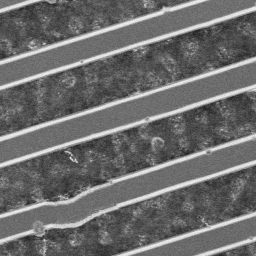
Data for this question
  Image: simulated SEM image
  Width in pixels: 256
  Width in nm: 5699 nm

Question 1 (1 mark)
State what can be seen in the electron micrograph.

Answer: one or a few lines or trenches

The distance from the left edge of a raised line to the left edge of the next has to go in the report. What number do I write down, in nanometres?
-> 1640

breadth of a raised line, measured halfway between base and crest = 0.528 um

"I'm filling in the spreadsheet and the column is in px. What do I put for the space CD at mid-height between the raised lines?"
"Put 49.4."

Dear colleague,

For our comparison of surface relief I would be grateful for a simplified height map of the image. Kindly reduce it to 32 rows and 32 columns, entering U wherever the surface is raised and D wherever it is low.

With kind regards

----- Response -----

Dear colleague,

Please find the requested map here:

UUUDDDDDDDDDDDDDDDDDDDDDUUUUUUUU
DDDDDDDDDDDDDDDDDDDDUUUUUUUUUUDD
DDDDDDDDDDDDDDDDDUUUUUUUUUUDDDDD
DDDDDDDDDDDDDDUUUUUUUUUUDDDDDDDD
DDDDDDDDDDDUUUUUUUUUUDDDDDDDDDDD
DDDDDDDDUUUUUUUUUUDDDDDDDDDDDDDD
DDDDDUUUUUUUUUDDDDDDDDDDDDDDDDDD
DUUUUUUUUUUDDDDDDDDDDDDDDDDDDDDD
UUUUUUUUDDDDDDDDDDDDDDDDDDDDDUUU
UUUUUDDDDDDDDDDDDDDDDDDDDDUUUUUU
UUDDDDDDDDDDDDDDDDDDDDUUUUUUUUUU
DDDDDDDDDDDDDDDDDDDUUUUUUUUUUUDD
DDDDDDDDDDDDDDDDUUUUUUUUUUDDDDDD
DDDDDDDDDDDDDUUUUUUUUUUDDDDDDDDD
DDDDDDDDDDUUUUUUUUUUDDDDDDDDDDDD
DDDDDDUUUUUUUUUUUDDDDDDDDDDDDDDD
DDDUUUUUUUUUUUDDDDDDDDDDDDDDDDDD
UUUUUUUUUUDDDDDDDDDDDDDDDDDDDDDU
UUUUUUUDDDDDDDDDDDDDDDDDDDDUUUUU
UUUUDDDDDDDDDDDDDDDDDDDDUUUUUUUU
UDDDDDDDDDDDDDDDDDDDDUUUUUUUUUUD
DDDDDDDDDDDDDDDDDDUUUUUUUUUUDDDD
DDDDDDDDDDDDDDDUUUUUUUUUUDDDDDDD
DDDDDDDDDDDDUUUUUUUUUDDDDDDDDDDD
DDDDDDDDDDUUUUUUUUUDDDDDDDDDDDDD
DDDDDDUUUUUUUUUDDDDDDDDDDDDDDDDD
DDUUUUUUUUUUUDDDDDDDDDDDDDDDDDDD
UUUUUUUUUUUDDDDDDDDDDDDDDDDDDDUU
UUUUUUDDDDDDDDDDDDDDDDDDDDDUUUUU
UUDDDDDDDDDDDDDDDDDDDDDUUUUUUUUU
DDDDDDDDDDDDDDDDDDDDUUUUUUUUUUDD
DDDDDDDDDDDDDDDDDUUUUUUUUUDDDDDD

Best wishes